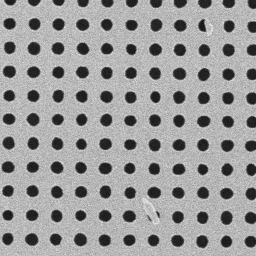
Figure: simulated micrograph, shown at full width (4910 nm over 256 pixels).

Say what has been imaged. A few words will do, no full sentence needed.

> a regular array of holes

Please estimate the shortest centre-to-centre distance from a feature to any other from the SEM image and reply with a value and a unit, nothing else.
23.7 pixels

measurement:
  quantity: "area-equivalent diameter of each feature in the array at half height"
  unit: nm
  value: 238